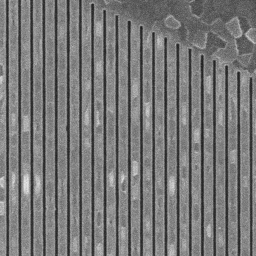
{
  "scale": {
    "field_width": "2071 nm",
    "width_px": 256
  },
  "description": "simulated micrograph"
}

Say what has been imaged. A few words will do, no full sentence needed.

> parallel lines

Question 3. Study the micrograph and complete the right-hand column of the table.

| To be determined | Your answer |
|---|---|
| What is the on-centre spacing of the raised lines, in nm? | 98.4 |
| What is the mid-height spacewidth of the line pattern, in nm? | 24.3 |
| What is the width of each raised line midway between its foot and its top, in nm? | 71.8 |